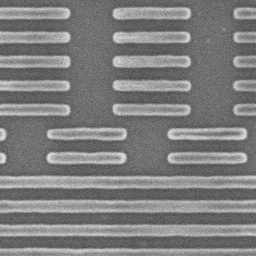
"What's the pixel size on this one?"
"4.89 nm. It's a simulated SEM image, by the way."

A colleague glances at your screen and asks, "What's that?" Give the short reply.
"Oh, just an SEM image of wiring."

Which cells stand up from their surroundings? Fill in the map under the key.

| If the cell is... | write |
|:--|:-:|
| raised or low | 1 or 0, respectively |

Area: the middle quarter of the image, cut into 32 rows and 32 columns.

10000000000001111111111111000110
00000000000000000000000000000000
00000000000000000000000000000000
00000000000000000000000000000000
10000000000001111111111111111110
10000000000011111111111111111111
10000000000000111111111111111110
00000000000000000000000000000000
00000000000000000000000000000000
00000000000000000000000000000000
10000000000011111111111111111110
10000000000011111111111111111111
10000000000001111111111111111110
00000000000000000000000000000000
00000000000000000000000000000000
00000000000000000000000000000000
11111111111111100000000000011111
11111111111111100000000000111111
11111111111111100000000000111111
00000000000000000000000000000000
00000000000000000000000000000000
00000000000000000000000000000000
11111101111111100000000000011111
11111111111111100000000000111111
11111111111111100000000000111111
00000000000000000000000000000000
00000000000000000000000000000000
00000000000000000000000000000000
11111111111111111111111111111111
11111111111111111111111111111111
11111111111111111111111111111111
00000000000000000000000000000000